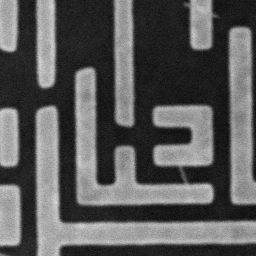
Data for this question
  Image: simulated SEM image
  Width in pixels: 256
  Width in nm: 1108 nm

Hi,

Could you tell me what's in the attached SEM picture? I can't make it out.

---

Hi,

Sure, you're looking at wiring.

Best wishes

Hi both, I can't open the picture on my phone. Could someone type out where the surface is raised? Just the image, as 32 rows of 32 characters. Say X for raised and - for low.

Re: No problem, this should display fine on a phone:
XX---XX-------XX--------XX------
XX---XX-------XX--------XXX-----
XX---XX-------XX--------XX------
XX---XX-------XXX-------XX---XX-
XX---XX-------XXX-------XX---XX-
XX---XX-------XXX-------XX---XX-
-----XX-------XXX------------XX-
-----XX-------XXX------------XX-
-----XX-------XXX------------XX-
-----XX--XXX--XXX------------XX-
-----X---XXX--XXX------------XX-
---------XXX--XXX------------XX-
---------XXX--XXX------------XX-
------X--XXX---XX---XXXXXX---XX-
XX---XX--XXX--XXX--XXXXXXX---XX-
XX---XX---XX---X---XXXXXXX---XX-
XX---XX---XX------------XX---XX-
XX---XX---XX------------XX---XX-
XX---XX---XX---X----XXXXXX---XX-
XX---XX---XX--XXX--XXXXXXX---XX-
XX---XX---XX--XXX---XXXXXX---XX-
-----XX---XX--XXX------------XX-
-----XX---XX--XXX------------XXX
XX---XX---XXXXXXXXXXXXXXXX---XXX
XX---XX---XXXXXXXXXXXXXXXXX--XXX
XX---XX---XXXXXXXX--------------
XX---XX-------------------------
XX---XXX------------------------
XX---XXXXXXXXXXXXXXXXXXXXXXXXXXX
XX---XXXXXXXXXXXXXXXXXXXXXXXXXXX
XX---XXX------------------------
-----XX-------------------------